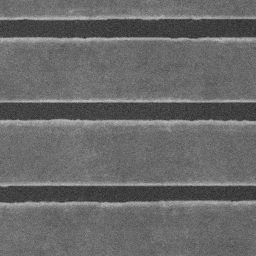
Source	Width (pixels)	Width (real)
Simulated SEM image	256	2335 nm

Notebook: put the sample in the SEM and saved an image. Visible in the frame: lines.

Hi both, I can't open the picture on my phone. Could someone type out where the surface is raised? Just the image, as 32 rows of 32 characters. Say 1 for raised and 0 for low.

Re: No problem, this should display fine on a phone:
11111111111111111111111111111111
11111111111111111111111111111111
00000000000000000000000000000000
00000000000000000000000000000000
00000000000000000000000000000000
11111111111111111111111111111111
11111111111111111111111111111111
11111111111111111111111111111111
11111111111111111111111111111111
11111111111111111111111111111111
11111111111111111111111111111111
11111111111111111111111111111111
11111111111111111111111111111111
00000000000000000000000000000000
00000000000000000000000000000000
11111111111111111111111111111111
11111111111111111111111111111111
11111111111111111111111111111111
11111111111111111111111111111111
11111111111111111111111111111111
11111111111111111111111111111111
11111111111111111111111111111111
11111111111111111111111111111111
00000000000000000000000000000000
00000000000000000000000000000000
00111111111111011111111111111111
11111111111111111111111111111111
11111111111111111111111111111111
11111111111111111111111111111111
11111111111111111111111111111111
11111111111111111111111111111111
11111111111111111111111111111111